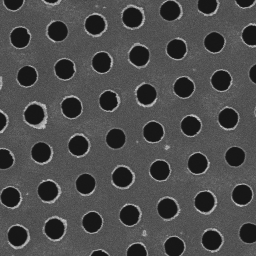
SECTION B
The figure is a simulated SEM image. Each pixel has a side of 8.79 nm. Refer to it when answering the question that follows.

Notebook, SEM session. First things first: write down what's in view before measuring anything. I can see a regular array of holes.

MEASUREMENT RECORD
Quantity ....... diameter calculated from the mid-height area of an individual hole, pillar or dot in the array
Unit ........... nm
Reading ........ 170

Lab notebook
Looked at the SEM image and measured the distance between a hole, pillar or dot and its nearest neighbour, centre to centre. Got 334 nanometers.